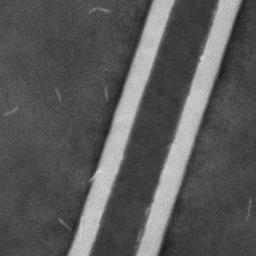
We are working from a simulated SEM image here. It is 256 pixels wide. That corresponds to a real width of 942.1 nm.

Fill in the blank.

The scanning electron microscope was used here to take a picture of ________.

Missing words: one or a few lines or trenches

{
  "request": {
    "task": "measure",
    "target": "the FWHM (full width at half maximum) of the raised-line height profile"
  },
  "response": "226 nanometres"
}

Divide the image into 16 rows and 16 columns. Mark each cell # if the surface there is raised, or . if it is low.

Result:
..........####..
..........####..
.........####...
.........####...
.........####...
........####....
........####....
........####....
........####....
.......####.....
.......####.....
......#####.....
......####......
......####......
......####......
.....####.......